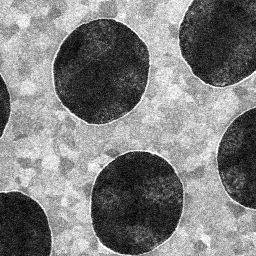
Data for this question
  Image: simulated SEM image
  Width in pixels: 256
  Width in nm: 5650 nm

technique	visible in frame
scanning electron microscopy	holes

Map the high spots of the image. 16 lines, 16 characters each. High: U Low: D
UUUUUUUUUUUUDDDD
UUUUUDDDUUUDDDDD
UUUUDDDDDUUDDDDD
UUUDDDDDDUUDDDDD
UUUDDDDDDUUUDDDD
UUUDDDDDDUUUUUUU
DUUUDDDDDUUUUUUU
DUUUUDDUUUUUUUUD
UUUUUUUUUUUUUUDD
UUUUUUUUDUUUUUDD
UUUUUUDDDDDUUUDD
UUUUUUDDDDDUUUDD
DDUUUUDDDDDUUUUD
DDDUUUDDDDDUUUUU
DDDUUUDDDDDUUUUU
DDDUUUUDDDUUUUUU